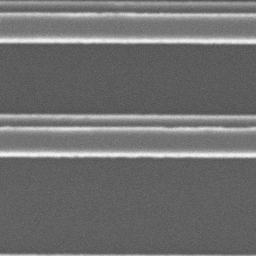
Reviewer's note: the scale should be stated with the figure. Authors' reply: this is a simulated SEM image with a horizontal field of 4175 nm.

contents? lines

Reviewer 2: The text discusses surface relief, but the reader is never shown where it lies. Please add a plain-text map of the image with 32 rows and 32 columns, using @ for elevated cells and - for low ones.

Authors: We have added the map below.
@@@@@@@@@@@@@@@@@---------------
@@@@@@@@@@@@@@@@@@@@@@@@@@@@@@@@
@@@@@@@@@@@@@@@@@@@@@@@@@@@@@@@@
@@@@@@@@@@@@@@@@@@@@@@@@@@@@@@@@
@@@@@@@@@@@@@@@@@@@@@@@@@@@@@@@@
--------------------------------
--------------------------------
--------------------------------
--------------------------------
--------------------------------
--------------------------------
--------------------------------
--------------------------------
--------------------------------
--------------------------------
@@@@@@@@@@@@@@@@@@@@@@@@@@@@@@@@
@@@@@@@@@@@@@@@@@@@@@@@@@@@@@@@@
@@@@@@@@@@@@@@@@@@@@@@@@@@@@@@@@
@@@@@@@@@@@@@@@@@@@@@@@@@@@@@@@@
-------------------------@@@@@@@
--------------------------------
--------------------------------
--------------------------------
--------------------------------
--------------------------------
--------------------------------
--------------------------------
--------------------------------
--------------------------------
--------------------------------
--------------------------------
--------------------------------